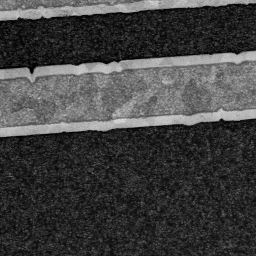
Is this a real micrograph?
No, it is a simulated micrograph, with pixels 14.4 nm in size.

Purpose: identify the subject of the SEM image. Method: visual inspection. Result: one or a few lines or trenches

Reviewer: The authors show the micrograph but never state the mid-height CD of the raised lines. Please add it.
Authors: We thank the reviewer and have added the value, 830 nanometers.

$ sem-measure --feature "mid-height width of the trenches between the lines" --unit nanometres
845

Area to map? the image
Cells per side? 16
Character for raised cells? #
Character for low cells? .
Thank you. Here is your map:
########........
................
................
................
...#############
################
################
###########.....
................
................
................
................
................
................
................
................